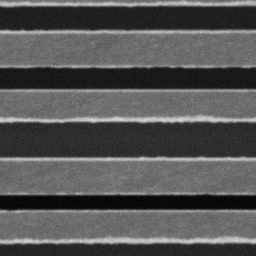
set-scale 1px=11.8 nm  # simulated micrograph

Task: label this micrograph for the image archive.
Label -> lines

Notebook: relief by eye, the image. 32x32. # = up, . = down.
################################
................................
................................
................................
################################
################################
################################
################################
................................
................................
................................
################################
################################
################################
################################
................................
................................
................................
................................
................................
################################
################################
################################
################################
................................
................................
################################
################################
################################
################################
................................
................................